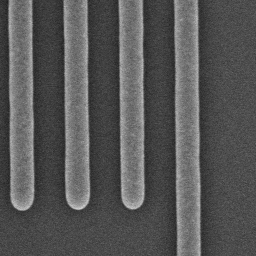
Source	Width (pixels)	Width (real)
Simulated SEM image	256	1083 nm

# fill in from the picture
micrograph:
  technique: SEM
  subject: groups of lines, slits or small figures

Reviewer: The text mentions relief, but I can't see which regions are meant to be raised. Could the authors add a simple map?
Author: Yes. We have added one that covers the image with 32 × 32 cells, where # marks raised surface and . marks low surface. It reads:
.###....###....###....###.......
.###....###....###....###.......
.###....###....###....###.......
.###....###....###....###.......
.###....###....###....###.......
.###....###....###....###.......
.###....###....###....###.......
.###....###....###....###.......
.###....###....###....###.......
.###....###....###....###.......
.###....###....###....###.......
.###....###....###....###.......
.###....###....###....###.......
.###....###....###....###.......
.###....###....###....###.......
.###....###....###....###.......
.###....###....###....###.......
.###....###....###....###.......
.###....###....###....###.......
.###....###....###....###.......
.###....###....###....###.......
.###....###....###....###.......
.###....###....###....###.......
.###....###....###....###.......
.###....###....###....###.......
..##.....##....###....###.......
......................###.......
......................###.......
......................###.......
......................###.......
......................###.......
......................###.......